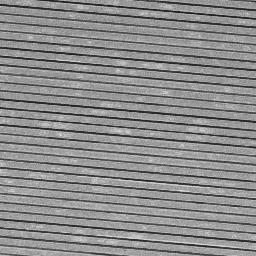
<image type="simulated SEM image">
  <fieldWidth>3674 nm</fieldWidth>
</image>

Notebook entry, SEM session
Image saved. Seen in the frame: parallel lines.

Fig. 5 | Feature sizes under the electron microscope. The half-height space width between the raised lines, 39.3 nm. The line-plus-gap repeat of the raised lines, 123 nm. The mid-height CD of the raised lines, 92.9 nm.